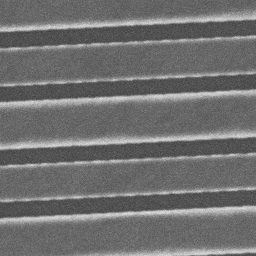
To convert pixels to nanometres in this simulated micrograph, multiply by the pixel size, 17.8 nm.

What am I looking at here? lines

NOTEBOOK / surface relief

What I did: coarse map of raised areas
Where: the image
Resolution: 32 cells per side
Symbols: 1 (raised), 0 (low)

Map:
11111111111111111111111111111111
11111111111111111111111111111111
11111111111111111111111111110000
11111110000000000000000000000000
00000000000000000000000000000000
00000000000000111111111111111111
11111111111111111111111111111111
11111111111111111111111111111111
11111111111111111111111111111111
11111111111111111111111111000000
11110000000000000000000000000000
00000000000000000000000000001111
00000000001111111111111111111111
11111111111111111111111111111111
11111111111111111111111111111111
11111111111111111111111111111111
11111111111111111111111111111111
11111111111111111111100000000000
10000000000000000000000000000000
00000000000000000000000000111111
00000111111111111111111111111111
11111111111111111111111111111111
11111111111111111111111111111111
11111111111111111111111111111111
11111111111111100000000000000000
00000000000000000000000000000000
00000000000000000001111111111111
11111111111111111111111111111111
11111111111111111111111111111111
11111111111111111111111111111111
11111111111111111111111111111111
11111111111111111111111111111110